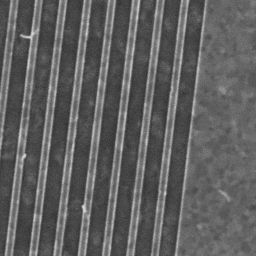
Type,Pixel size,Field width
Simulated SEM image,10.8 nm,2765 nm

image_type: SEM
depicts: parallel lines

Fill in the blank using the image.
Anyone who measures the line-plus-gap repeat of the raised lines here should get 261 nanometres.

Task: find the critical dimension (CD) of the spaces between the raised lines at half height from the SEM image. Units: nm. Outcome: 193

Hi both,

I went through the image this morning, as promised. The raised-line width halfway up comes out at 6.94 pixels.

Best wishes